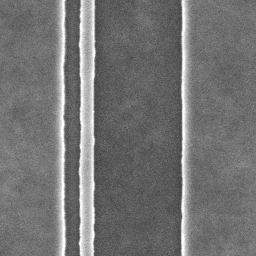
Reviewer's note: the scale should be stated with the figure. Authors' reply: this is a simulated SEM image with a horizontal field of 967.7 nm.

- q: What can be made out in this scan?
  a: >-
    lines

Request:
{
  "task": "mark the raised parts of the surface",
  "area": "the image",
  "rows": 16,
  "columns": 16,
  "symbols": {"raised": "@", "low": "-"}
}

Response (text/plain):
@@@@@@-----@@@@@
@@@@@@-----@@@@@
@@@@@@-----@@@@@
@@@@@@-----@@@@@
@@@@@@-----@@@@@
@@@@@@-----@@@@@
@@@@@@-----@@@@@
@@@@@@-----@@@@@
@@@@@@-----@@@@@
@@@@@@-----@@@@@
@@@@@@-----@@@@@
@@@@@@-----@@@@@
@@@@@@-----@@@@@
@@@@@@-----@@@@@
@@@@@@-----@@@@@
@@@@@@-----@@@@@